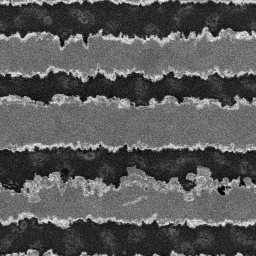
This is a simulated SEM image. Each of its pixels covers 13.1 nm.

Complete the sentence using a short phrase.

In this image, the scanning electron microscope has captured one or a few lines or trenches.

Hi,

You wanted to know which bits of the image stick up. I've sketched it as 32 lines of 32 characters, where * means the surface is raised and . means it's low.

................................
................................
................................
................................
...****....**........**..*.*****
*******.************************
********************************
********************************
********************************
...*......**......**.....*......
................................
................................
****...***.***......**.*..*.....
****************************.***
********************************
********************************
********************************
********************************
***.......*...*..***........****
................................
................................
................**..............
....***..**....*****.....*..**.*
*...********.**********.***.****
********************************
********************************
********************************
**...****...*******.************
................................
................................
................................
................................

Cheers